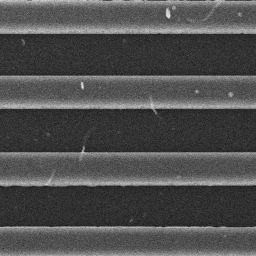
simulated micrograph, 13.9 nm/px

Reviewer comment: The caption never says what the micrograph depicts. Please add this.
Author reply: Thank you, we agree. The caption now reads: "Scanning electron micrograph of lines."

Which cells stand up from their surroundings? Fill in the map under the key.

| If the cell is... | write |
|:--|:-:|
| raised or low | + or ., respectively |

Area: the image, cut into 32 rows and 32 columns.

++++++++++++++++++++++++++++++++
++++++++++++++++++++++++++++++++
++++++++++++++++++++++++++++++++
++++++++++++++++++++++++++++++++
................................
................................
................................
................................
................................
................................
++++++++++++++++++++++++++++++++
++++++++++++++++++++++++++++++++
++++++++++++++++++++++++++++++++
++++++++++++++++++.+++++++++++.+
................................
................................
................................
................................
................................
++++++++++++++++++++++++++++++++
++++++++++++++++++++++++++++++++
++++++++++++++++++++++++++++++++
++++++++++++++++++++++++++++++++
................................
................................
................................
................................
................................
++++++++++++++++++++++++++++++++
++++++++++++++++++++++++++++++++
++++++++++++++++++++++++++++++++
++++++++++++++++++++++++++++++++